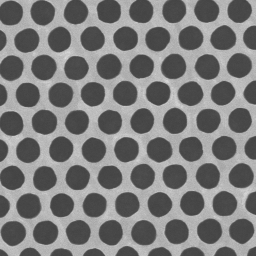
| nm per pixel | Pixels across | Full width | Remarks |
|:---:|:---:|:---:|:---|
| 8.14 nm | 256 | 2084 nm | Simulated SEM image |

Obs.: a regular array of holes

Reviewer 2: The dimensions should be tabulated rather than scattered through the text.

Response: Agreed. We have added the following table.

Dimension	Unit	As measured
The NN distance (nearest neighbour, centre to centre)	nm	257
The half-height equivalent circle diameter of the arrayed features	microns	0.198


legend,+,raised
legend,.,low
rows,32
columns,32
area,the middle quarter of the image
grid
......++......++.......+.......+
......++......++......++......++
......+++.....+++.....+++.....++
+....+++++..++++++..++++++...+++
+++++++.++++++..+++++++..+++++++
.++++.....+++.....+++.....+++...
..++......++......+++......++...
..++......++......+++......+....
..++......++......+++.....+++...
..+++.....+++.....+++.....+++...
++++++..+++++++++++++++++++++++.
++++++++++++++++++...+++++...+++
+.....+++.....+++.....+++.....++
+.....+++.....+++......++......+
......++.......++......++......+
......+++.....+++.....+++.....++
+.....+++.....+++.....++++....++
++..+++++++.+++++++.++++++++++++
.+++++++++++++...++++++.++++++..
..+++.....+++.....+++.....+++...
..+++.....+++......++......++...
..+++......++......++......++...
..+++.....+++.....+++......++...
.++++.....+++.....++++....++++..
+++++++.+++++++.++++++++++++++++
++..++++++..++++++...+++++....++
+.....+++.....+++.....+++.....++
+......++.....+++......++......+
.......+.......++......++......+
+.....+++.....+++.....+++.....++
+.....+++.....++++....++++...+++
+++.++++++++++++++++++++++++++++